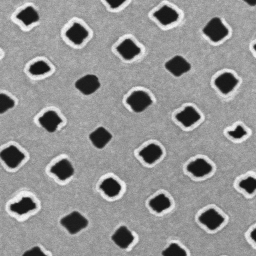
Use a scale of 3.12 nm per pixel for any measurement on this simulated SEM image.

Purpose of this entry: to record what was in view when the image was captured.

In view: a regular array of holes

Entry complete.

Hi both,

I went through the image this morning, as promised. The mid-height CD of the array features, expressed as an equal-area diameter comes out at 60.4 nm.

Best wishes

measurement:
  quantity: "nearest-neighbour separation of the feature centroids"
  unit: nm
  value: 159